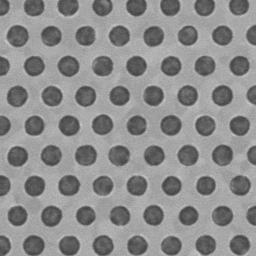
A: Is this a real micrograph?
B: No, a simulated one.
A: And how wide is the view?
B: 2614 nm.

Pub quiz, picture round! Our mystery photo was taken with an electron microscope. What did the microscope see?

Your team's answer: a regular array of holes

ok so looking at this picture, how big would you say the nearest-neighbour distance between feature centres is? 0.346 micrometres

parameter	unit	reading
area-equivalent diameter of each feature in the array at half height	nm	218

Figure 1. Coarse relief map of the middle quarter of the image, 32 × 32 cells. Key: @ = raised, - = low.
----@@@------@@------@@@------@@
----@@@-----@@@@-----@@@-----@@@
---@@@@@----@@@@----@@@@@----@@@
@@@@@@@@@@@@@@@@@@@@@@@@@@@@@@@@
@@@@@@@@@@@@@@@@@@@@@@@@@@@@@@@@
@@@@---@@@@@@--@@@@@@---@@@@@@--
@@@-----@@@@----@@@@-----@@@@---
@@@-----@@@-----@@@@-----@@@----
@@@-----@@@-----@@@@-----@@@----
@@@-----@@@@----@@@@-----@@@@---
@@@@--@@@@@@@--@@@@@@--@@@@@@@--
@@@@@@@@@@@@@@@@@@@@@@@@@@@@@@@@
@@@@@@@@@@@@@@@@@@@@@@@@@@@@@@@@
---@@@@@----@@@@----@@@@@----@@@
----@@@-----@@@@-----@@@-----@@@
----@@@-----@@@@-----@@@-----@@@
----@@@-----@@@@-----@@@-----@@@
---@@@@@---@@@@@@---@@@@@---@@@@
@@@@@@@@@@@@@@@@@@@@@@@@@@@@@@@@
@@@@@@@@@@@@@@@@@@@@@@@@@@@@@@@@
@@@@---@@@@@@--@@@@@@@-@@@@@@@--
@@@-----@@@-----@@@@-----@@@@---
@@@-----@@@------@@@-----@@@----
@@@-----@@@------@@@-----@@@----
@@@-----@@@@----@@@@-----@@@@---
@@@@@-@@@@@@@-@@@@@@@@@@@@@@@@--
@@@@@@@@@@@@@@@@@@@@@@@@@@@@@@@@
@@@@@@@@@@@@@@@@@@@@@@@@@@@@@@@@
---@@@@@----@@@@@---@@@@@---@@@@
----@@@-----@@@@-----@@@@----@@@
----@@@------@@@-----@@@-----@@@
----@@@-----@@@@-----@@@@----@@@